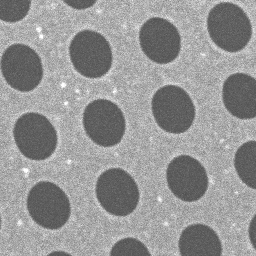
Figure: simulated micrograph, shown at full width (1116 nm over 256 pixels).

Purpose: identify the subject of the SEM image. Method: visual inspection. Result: a regular array of holes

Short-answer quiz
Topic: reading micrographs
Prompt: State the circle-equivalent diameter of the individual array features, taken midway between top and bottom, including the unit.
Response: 46 pixels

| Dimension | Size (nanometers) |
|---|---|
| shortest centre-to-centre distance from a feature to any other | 306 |